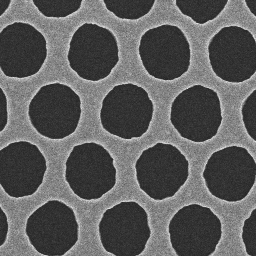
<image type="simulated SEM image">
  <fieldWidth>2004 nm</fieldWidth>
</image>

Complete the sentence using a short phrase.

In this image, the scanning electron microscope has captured holes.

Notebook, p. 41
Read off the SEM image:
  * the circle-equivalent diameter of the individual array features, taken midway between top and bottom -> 419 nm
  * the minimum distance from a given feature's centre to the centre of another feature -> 533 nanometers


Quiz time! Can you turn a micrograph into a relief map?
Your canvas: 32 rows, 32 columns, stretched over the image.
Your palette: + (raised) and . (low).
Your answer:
.+++......+++......+++......+++.
.++++....+++++.....++++.....+++.
++++++++++++++++++++++++..++++++
+...++++++...++++++...++++++..++
.....++++.....++++.....++++.....
......+++......++.......++......
......+++......++.......++......
......+++......+++......++......
.....++++.....++++.....++++.....
+...++++++...++++++....++++....+
++++++..++++++++.+++++++++++++++
+++++....+++++....+++++....+++++
.+++......+++......+++.....++++.
.+++......+++......++.......++..
.+++......+++......++.......++..
.+++......+++......+++......+++.
+++++....+++++....++++.....++++.
++++++++++++++++++++++++..++++++
.....++++....++++++...++++++..++
.....++++.....++++.....+++.....+
......++......+++.......++......
......++......+++.......+.......
.....+++......+++......+++......
.....++++.....++++....++++.....+
+..+++++++...++++++..++++++....+
++++++..+++++++..+++++++++++++++
++++.....++++.....++++.....+++++
.++.......+++.....+++......++++.
.++.......++.......++.......++..
.++.......+++......++.......++..
++++.....++++.....+++......++++.
+++++...++++++....++++.....++++.